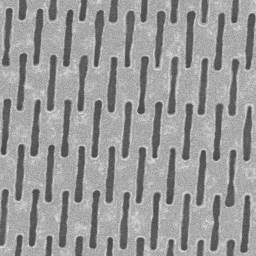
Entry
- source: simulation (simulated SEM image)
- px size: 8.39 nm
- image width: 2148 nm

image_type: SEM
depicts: a regular array of holes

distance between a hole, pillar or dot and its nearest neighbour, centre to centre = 30.2 pixels